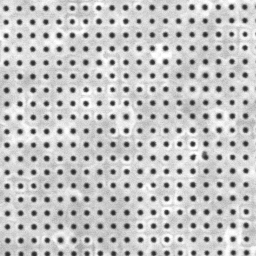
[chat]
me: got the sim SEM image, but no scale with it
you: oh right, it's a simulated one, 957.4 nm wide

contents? a regular array of holes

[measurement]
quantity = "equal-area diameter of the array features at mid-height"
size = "20.7 nm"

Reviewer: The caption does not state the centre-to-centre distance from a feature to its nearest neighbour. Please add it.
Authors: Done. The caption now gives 0.0484 microns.